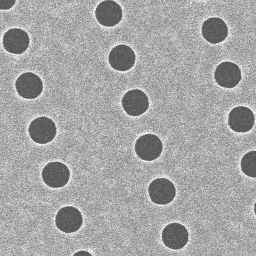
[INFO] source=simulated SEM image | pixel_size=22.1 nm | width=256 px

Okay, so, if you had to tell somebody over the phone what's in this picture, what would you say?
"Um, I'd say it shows a regular array of holes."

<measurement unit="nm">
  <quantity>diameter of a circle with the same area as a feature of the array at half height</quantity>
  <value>605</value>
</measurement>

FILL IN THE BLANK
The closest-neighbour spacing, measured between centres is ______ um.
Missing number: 1.03